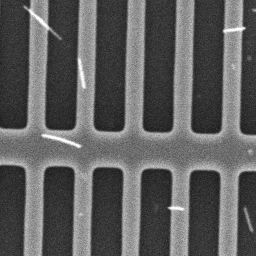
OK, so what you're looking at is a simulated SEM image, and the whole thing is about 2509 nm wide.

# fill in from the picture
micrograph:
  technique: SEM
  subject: groups of lines, slits or small figures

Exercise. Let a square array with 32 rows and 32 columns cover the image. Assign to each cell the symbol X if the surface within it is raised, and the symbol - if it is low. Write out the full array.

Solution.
----XX----XX----XX----XX----XX--
----XX----XX----XX----XX----XX--
----XX----XX----XX----XX----XX--
----XX----XX----XX----XX----XX--
----XX----XX----XX----XX----XX--
----XX----XX----XX----XX----XX--
----XX----XX----XX----XX----XX--
----XX----XX----XX----XX----XX--
----XX----XX----XX----XX----XX--
----XX----XX----XX----XX----XX--
----XX----XX----XX----XX----XX--
----XX----XX----XX----XX----XX--
----XX----XX----XX----XX----XX--
----XX----XX----XX----XX----XX--
----XX----XX----XX----XX----XX--
---XXX----XX----XX----XX----XX--
XXXXXXXXXXXXX--XXX---XXX---XXX--
XXXXXXXXXXXXXXXXXXXXXXXXXXXXXXXX
XXXXXXXXXXXXXXXXXXXXXXXXXXXXXXXX
XXXXXXXXXXXXXXXXXXXXXXXXXXXXXXXX
XXXXXXXXXXXXXXXXXXXXXXXXXXXXXXXX
---XX----XXX---XXX---XXX---XXX--
---XX----XX----XXX----XX----XX--
---XX----XX----XXX----XX----XX--
---XX----XX----XXX----XX----XX--
---XX----XX----XXX---XXX----XX--
---XX----XX----XX----XX-----XX--
---XX----XX----XX----XX-----XX--
---XX----XX----XX----XX-----XX--
---XX----XX----XX----XX-----XX--
---XX----XX----XX----XX----XXX--
---XX----XX----XX----XX----XXX--